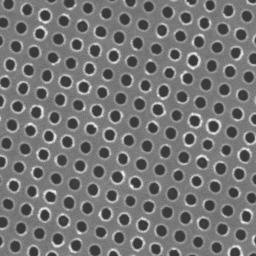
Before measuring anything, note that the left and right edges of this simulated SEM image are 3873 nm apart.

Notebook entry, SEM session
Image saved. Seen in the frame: a regular array of holes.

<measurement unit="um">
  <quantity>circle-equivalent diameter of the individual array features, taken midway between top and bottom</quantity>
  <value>0.171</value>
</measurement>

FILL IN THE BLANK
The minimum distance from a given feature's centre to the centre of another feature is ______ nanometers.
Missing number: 288